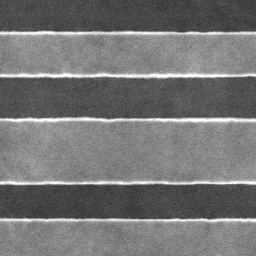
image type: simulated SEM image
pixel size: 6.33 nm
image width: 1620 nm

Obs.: lines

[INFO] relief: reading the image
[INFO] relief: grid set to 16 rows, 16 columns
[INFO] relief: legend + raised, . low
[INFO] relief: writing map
................
................
++++++++++++++++
++++++++++++++++
++++++++++++++++
................
................
+++++++++++++++.
++++++++++++++++
++++++++++++++++
++++++++++++++++
................
................
................
++++++++++++++++
++++++++++++++++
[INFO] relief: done